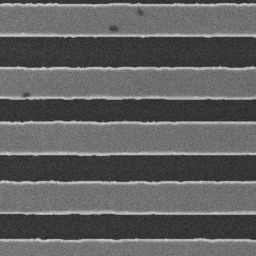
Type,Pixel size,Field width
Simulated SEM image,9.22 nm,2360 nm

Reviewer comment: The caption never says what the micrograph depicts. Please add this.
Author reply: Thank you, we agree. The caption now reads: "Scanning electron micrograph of lines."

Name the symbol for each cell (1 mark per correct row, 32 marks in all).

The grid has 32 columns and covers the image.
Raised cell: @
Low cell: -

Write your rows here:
@@@@@@@@-----@@@@@---@@----@@@@@
@@@@@@@@@@@@@@@@@@@@@@@@@@@@@@@@
@@@@@@@@@@@@@@@@@@@@@@@@@@@@@@@@
@@@@@@@@@@@@@@@@@@@@@@@@@@@@@@@@
@@@@@@@@@@@@@@@@@@@@@@@@@@@@@@@@
--------------------------------
--------------------------------
--------------------------------
@@@@-@-@@--@@@@@@@@@@@@@@@@@@-@@
@@@@@@@@@@@@@@@@@@@@@@@@@@@@@@@@
@@@@@@@@@@@@@@@@@@@@@@@@@@@@@@@@
@@@@@@@@@@@@@@@@@@@@@@@@@@@@@@@@
--------------------------------
--------------------------------
--------------------------------
@@@@@@@@@@@@@@@@@@@@@@@@@@@@@@@@
@@@@@@@@@@@@@@@@@@@@@@@@@@@@@@@@
@@@@@@@@@@@@@@@@@@@@@@@@@@@@@@@@
@@@@@@@@@@@@@@@@@@@@@@@@@@@@@@@@
--------------------------------
--------------------------------
--------------------------------
--------------------------------
@@@@@@@@@@@@@@@@@@@@@@@@@@@@@@@@
@@@@@@@@@@@@@@@@@@@@@@@@@@@@@@@@
@@@@@@@@@@@@@@@@@@@@@@@@@@@@@@@@
@@@@@@@@@@@@@@@@@@@@@@@@@@@@@@@@
--------------------------------
--------------------------------
--------------------------------
@@@@@@@@@@@@@@@@@@@@@@@@@@@@@@@@
@@@@@@@@@@@@@@@@@@@@@@@@@@@@@@@@